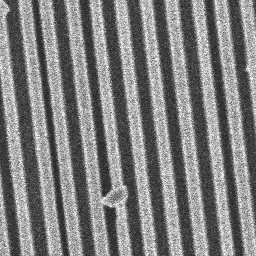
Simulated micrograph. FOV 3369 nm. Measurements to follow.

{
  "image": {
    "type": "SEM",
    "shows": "parallel lines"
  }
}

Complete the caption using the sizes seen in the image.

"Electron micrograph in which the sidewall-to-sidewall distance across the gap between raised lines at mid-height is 172 nm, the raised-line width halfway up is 0.17 micrometres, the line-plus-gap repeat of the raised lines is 323 nanometers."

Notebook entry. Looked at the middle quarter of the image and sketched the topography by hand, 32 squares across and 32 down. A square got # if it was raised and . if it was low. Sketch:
..####..###....##....###...###..
...###..###....###...###...###..
...###...##....###...###...####.
...###...##....###...###....###.
...###...###...###....##....###.
...###...###...###....###...###.
...###...###...###....###...###.
...###...###...###....###...###.
...####..###....##....###...###.
...####..###....###...###...###.
...####..###....###...###...####
....###...##....###...###...####
....###...###...###....##....###
....###...###...###....###...###
....###...###...###....###...###
#...###...###...###....###...###
#...####..###...###....###...###
#....###..###....##....###...###
#....###..###....###...###...###
#....###...##....###...###...###
#....###...###...###....##....##
#....###...###...###....###...##
#....###...###...###....###...##
##...###...###...###....###...##
##...###...###....##....###...##
##...####..###....##....###...##
##....###..###....###...###...##
##....###...##....###...###...##
##....###...###...###...###....#
##....###...###...###....##....#
##....###...###...###....###...#
###...###...####..###....###...#